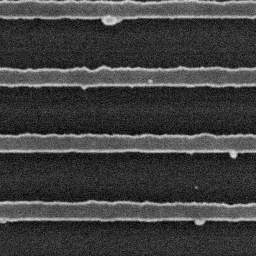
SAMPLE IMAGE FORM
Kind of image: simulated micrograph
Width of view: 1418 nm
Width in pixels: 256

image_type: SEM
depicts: lines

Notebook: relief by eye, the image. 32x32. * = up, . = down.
********************************
********************************
.............**.................
................................
................................
................................
................................
................................
............**........*....*....
********************************
********************************
................................
................................
................................
................................
................................
................................
********************************
********************************
................................
................................
................................
................................
................................
................................
***************************....*
********************************
***.........**....*.....**......
................................
................................
................................
................................